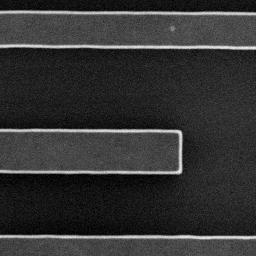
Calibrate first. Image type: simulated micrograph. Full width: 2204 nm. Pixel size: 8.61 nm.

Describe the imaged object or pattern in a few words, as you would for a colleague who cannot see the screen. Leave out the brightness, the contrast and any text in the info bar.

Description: groups of lines, slits or small figures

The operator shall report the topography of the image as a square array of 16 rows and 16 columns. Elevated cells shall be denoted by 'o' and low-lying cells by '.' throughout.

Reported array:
................
oooooooooooooooo
oooooooooooooooo
................
................
................
................
................
ooooooooooo.....
ooooooooooo.....
ooooooooooo.....
................
................
................
................
oooooooooooooooo